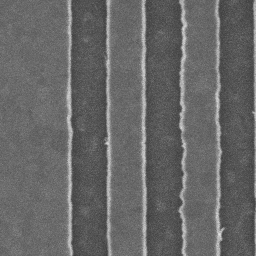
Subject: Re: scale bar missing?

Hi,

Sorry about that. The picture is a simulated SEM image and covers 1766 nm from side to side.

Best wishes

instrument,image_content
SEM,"one or a few lines or trenches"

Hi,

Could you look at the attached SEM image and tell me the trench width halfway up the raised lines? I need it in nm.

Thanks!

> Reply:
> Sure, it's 262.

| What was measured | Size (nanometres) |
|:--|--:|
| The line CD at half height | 249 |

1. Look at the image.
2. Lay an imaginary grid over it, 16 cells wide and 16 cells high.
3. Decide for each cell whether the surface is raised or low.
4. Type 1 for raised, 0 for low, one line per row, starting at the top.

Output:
1111000110011100
1111000110011100
1111000110011100
1111000110011100
1111000110011100
1111000110011100
1111000110011100
1111000110011100
1111000110011100
1111000110001100
1111000110011100
1111000110011100
1111000110011100
1111000110011100
1111000110011100
1111000110011100